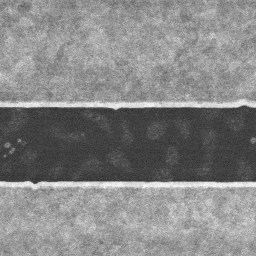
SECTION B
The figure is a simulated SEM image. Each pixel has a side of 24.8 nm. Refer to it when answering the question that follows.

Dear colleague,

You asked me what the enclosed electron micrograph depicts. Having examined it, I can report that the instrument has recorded one or a few lines or trenches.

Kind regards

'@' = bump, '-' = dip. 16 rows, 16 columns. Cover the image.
@@@@@@@@@@@@@@@@
@@@@@@@@@@@@@@@@
@@@@@@@@@@@@@@@@
@@@@@@@@@@@@@@@@
@@@@@@@@@@@@@@@@
@@@@@@@@@@@@@@@@
----@@@@@@@@@@@-
----------------
----------------
----------------
----------------
----------------
@@@@@@@@@@@@@@@@
@@@@@@@@@@@@@@@@
@@@@@@@@@@@@@@@@
@@@@@@@@@@@@@@@@